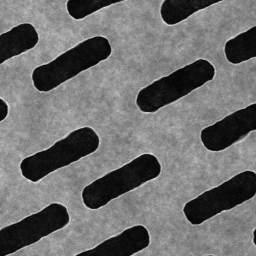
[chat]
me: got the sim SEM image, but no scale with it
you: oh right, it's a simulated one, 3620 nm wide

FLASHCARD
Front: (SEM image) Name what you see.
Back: holes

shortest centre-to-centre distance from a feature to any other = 1110 nm